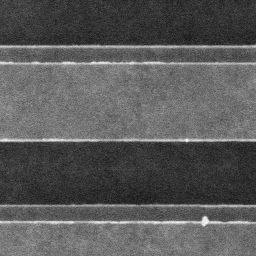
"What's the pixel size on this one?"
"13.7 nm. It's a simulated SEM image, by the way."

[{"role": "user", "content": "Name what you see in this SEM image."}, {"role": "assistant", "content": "lines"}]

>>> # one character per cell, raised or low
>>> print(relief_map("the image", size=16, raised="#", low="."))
................
................
................
################
################
################
################
################
################
................
................
................
................
################
################
################